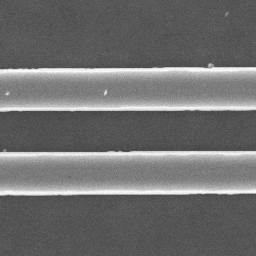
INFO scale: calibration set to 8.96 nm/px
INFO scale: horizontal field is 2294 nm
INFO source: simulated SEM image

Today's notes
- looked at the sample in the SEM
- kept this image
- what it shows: lines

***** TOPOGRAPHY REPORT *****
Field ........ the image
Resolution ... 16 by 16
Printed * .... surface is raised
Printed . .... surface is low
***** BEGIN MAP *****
................
................
................
................
****************
****************
****************
................
................
................
****************
****************
................
................
................
................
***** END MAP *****